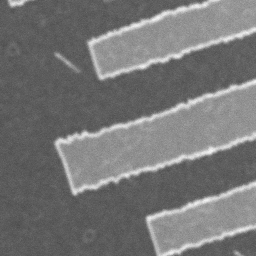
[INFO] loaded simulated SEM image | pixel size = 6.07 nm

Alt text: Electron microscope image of one or a few lines or trenches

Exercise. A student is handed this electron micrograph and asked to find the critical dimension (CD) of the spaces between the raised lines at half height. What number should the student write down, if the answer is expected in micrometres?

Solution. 0.287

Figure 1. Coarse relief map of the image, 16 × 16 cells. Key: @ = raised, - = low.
------------@@@@
---------@@@@@@@
------@@@@@@@@--
------@@@@@-----
------@@--------
--------------@@
------------@@@@
---------@@@@@@@
-----@@@@@@@@@@@
----@@@@@@@@@---
----@@@@@@------
----@@----------
-------------@@@
----------@@@@@@
---------@@@@@@-
----------@@----